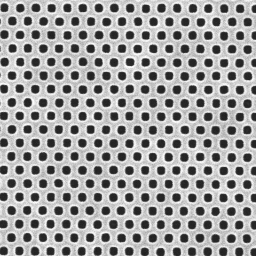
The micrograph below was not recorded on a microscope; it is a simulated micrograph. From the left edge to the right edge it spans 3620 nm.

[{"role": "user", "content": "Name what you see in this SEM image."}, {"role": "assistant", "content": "a regular array of holes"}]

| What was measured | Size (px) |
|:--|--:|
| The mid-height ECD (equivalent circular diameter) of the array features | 9.17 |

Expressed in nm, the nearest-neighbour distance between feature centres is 217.